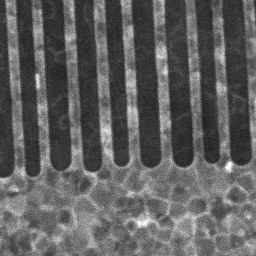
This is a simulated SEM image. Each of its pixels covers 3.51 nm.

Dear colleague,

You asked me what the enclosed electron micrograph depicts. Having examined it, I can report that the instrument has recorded parallel lines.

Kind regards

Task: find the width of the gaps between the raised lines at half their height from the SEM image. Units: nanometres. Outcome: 70.9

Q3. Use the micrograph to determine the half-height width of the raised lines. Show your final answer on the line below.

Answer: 32.4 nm